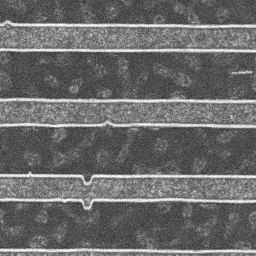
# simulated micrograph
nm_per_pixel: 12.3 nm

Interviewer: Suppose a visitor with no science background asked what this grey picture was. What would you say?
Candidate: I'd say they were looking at one or a few lines or trenches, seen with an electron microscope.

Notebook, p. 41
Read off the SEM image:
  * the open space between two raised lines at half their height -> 624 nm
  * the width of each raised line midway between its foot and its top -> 0.299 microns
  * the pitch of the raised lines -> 0.929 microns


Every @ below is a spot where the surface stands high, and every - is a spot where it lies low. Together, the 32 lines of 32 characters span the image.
--------------------------------
--------------------------------
--------------------------------
@@@@@@@@@@@@@@@@@@@@@@@@@@@@@@@@
@@@@@@@@@@@@@@@@@@@@@@@@@@@@@@@@
@@@@@@@@@@@@@@@@@@@@@@@@@@@@@@@@
--------------------------------
--------------------------------
--------------------------------
--------------------------------
--------------------------------
--------------------------------
-@@-----------------------------
@@@@@@@@@@@@@@@@@@@@@@@@@@@@@@@@
@@@@@@@@@@@@@@@@@@@@@@@@@@@@@@@@
@@@--@@@@@@@@-@@@@@@@@@@@@@@@@@@
--------------------------------
--------------------------------
--------------------------------
--------------------------------
--------------------------------
--------------------------------
@@@@@@@@@@-@@@@@@@@@@@@@@@@@@@@@
@@@@@@@@@@@@@@@@@@@@@@@@@@@@@@@@
@@@@@@@@@@@@@@@@@@@@@@@@@@@@@@@@
----------@---------------------
--------------------------------
--------------------------------
--------------------------------
--------------------------------
--------------------------------
@@@@@@@@@@@@@@@@@@@@@@@@-@@@@@--